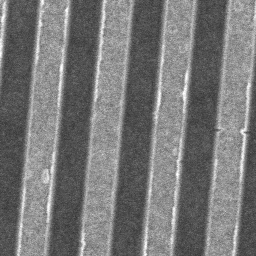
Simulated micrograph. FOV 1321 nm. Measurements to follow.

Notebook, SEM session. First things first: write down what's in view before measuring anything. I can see parallel lines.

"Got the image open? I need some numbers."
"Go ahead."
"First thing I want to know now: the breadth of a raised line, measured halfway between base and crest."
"0.154 µm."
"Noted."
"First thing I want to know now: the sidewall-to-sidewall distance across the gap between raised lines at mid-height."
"168 nm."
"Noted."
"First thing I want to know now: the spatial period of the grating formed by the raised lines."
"324 nanometers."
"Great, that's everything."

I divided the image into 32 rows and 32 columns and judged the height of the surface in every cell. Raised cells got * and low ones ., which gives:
*....****....****....***.....***
*....****....***.....***....****
*....****....***.....***....****
*....***.....***....****....****
.....***....****....****....****
.....***....****....****....****
....****....****....****....****
....****....****....****....****
....****....****....****....****
....****....****....****....***.
....****....****....***.....***.
....****....***.....***.....***.
....****....***.....***....****.
....***.....***.....***....****.
....***....****....****....****.
....***....****....****....****.
....***....****....****....****.
...****....****....****....****.
...****....****....****....****.
...****....****....****....****.
...****....****....***.....***..
...****....****....***.....***..
...****....****....***.....***..
...****....***.....***....****..
...***.....***....****....****..
...***....****....****....****..
...***....****....****....****..
..****....****....****....****..
..****....****....****....****..
..****....****....****....****..
..****....****....****....****..
..****....****....****....***...